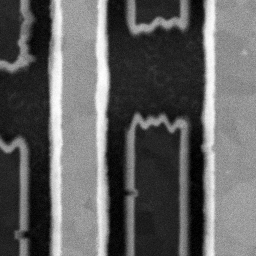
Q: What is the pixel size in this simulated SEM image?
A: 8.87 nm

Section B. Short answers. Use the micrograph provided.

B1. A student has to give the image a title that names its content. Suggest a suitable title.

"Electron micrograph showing one or a few lines or trenches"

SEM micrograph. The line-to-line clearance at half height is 264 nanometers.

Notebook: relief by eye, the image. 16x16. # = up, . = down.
##..##..###..###
##..##..##...###
#...##.......###
##..##.......###
....##.......###
....##.......###
...###.......###
....##.......###
....##..####.###
#...##..###..###
#...##..###..###
#...##..###..###
#...##..####.###
#...##..###..###
#...##..###..###
#...##..###..###